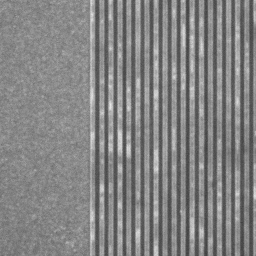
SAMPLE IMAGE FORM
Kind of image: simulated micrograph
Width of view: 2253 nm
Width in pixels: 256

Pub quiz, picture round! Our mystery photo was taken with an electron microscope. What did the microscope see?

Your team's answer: parallel lines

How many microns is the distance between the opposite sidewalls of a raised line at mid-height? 0.0418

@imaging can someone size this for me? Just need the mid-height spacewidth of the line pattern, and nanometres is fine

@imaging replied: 41.8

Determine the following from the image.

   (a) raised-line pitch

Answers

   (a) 79.9 nm